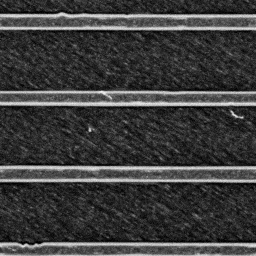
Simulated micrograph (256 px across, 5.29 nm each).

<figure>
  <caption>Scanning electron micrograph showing one or a few lines or trenches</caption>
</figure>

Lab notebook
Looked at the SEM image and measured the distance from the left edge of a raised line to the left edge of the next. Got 75.9 pixels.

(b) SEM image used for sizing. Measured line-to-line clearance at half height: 331 nm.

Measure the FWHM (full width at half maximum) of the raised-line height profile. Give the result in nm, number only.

72